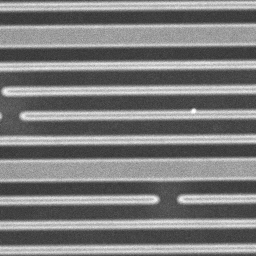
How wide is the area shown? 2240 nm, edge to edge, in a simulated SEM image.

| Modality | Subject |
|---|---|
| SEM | groups of lines, slits or small figures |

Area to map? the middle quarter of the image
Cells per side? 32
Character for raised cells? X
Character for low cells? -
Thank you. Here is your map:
XXXXXXXXXXXXXXXXXXXXXXXXXXXXXXXX
--------------------------------
--------------------------------
--------------------------------
--------------------------------
--------------------------------
XXXXXXXXXXXXXXXXXXXXXXXXXXXXXXXX
XXXXXXXXXXXXXXXXXXXXXXXXXXXX----
--------------------------------
--------------------------------
--------------------------------
--------------------------------
XXXXXXXXXXXXXXXXXXXXXXXXXXXXXXXX
XXXXXXXXXXXXXXXXXXXXXXXXXXXXXXXX
--------------------------------
--------------------------------
--------------------------------
--------------------------------
XXXXXXXXXXXXXXXXXXXXXXXXXXXXXXXX
XXXXXXXXXXXXXXXXXXXXXXXXXXXXXXXX
--------------------------------
--------------------------------
--------------------------------
--------------------------------
XXXXXXXXXXXXXXXXXXXXXXXXXXXXXXXX
XXXXXXXXXXXXXXXXXXXXXXXXXXXXXXXX
XXXXXXXXXXXXXXXXXXXXXXXXXXXXXXXX
XXXXXXXXXXXXXXXXXXXXXXXXXXXXXXXX
XXXXXXXXXXXXXXXXXXXXXXXXXXXXXXXX
--------------------------------
--------------------------------
--------------------------------